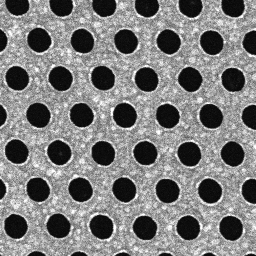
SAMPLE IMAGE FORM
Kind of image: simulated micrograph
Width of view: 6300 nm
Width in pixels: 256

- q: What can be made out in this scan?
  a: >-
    a regular array of holes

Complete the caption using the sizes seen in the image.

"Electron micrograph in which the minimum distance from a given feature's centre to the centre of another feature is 1040 nm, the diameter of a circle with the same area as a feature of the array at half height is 609 nm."